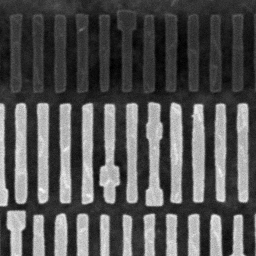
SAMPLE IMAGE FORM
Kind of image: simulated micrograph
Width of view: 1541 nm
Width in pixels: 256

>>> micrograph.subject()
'wiring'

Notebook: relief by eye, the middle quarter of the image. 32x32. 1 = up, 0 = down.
00001100011000011000111001110001
00001100011000011000111001110001
00011100011000011000111000110001
00011100011000011000111000110001
00011100011000011000111000110001
00011100011000011000111000110001
00011100011000011000111000110000
00000000000000000000000000000000
00000000000000000000000000000000
00000000000000000000000000000000
10000110001110001100011100011000
10000110001110001100011100011000
10000110001110001100011100011000
10000110001110001100011100011000
10000110001110001100011100011000
10000110001110001100011110011000
10000110001110001100011110011000
10000110001110001100011110011000
10000110001110001100011100011100
10000110001110001100011100011100
10000110001100001100011100011100
10000110001100001100011100011100
10000110001100001100011100011000
10000110001100001100011100011000
10000110001100001100001100011000
10000110001110001100001100011000
10000110011111001100001100011000
10000110011111001100001100011000
10000110011111001100011100011000
10000110011111001100011100011000
10000110001110001100011100011000
10000110001110001100011100011000